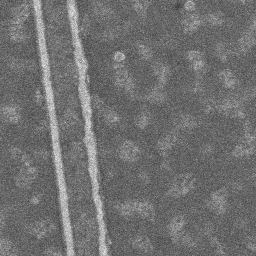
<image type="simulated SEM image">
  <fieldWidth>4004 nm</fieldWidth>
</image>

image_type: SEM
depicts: one or a few lines or trenches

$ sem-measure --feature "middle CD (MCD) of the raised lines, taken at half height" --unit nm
542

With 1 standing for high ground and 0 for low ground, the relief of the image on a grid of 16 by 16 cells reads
0011100000000000
0011100000000000
0001100000000000
0001100000000000
0001100000000000
0001100000000000
0001100000000000
0001110000000000
0001110000000000
0000110000000000
0000110000000000
0000110000000000
0000110000000000
0000110000000000
0000110000000000
0000110000000000